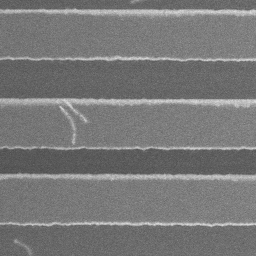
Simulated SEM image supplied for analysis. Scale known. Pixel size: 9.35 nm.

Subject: lines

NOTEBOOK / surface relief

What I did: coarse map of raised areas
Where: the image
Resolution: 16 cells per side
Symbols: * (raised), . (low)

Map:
................
****************
****************
****************
................
................
****************
****************
****************
................
................
****************
****************
****************
................
................